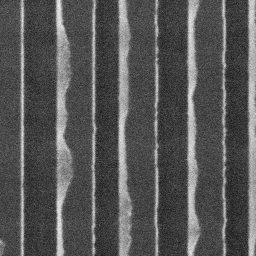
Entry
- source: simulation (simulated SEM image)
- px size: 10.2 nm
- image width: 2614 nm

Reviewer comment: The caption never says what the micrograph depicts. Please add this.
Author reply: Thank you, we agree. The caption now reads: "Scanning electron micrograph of lines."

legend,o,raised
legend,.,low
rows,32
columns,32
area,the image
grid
ooo....ooooo...ooooo....oooo...o
ooo....ooooo...ooooo....oooo...o
ooo....ooooo...ooooo....oooo...o
ooo....ooooo...ooooo....oooo...o
ooo.....oooo...ooooo....oooo....
ooo.....oooo...ooooo....oooo....
ooo.....oooo...ooooo....oooo....
ooo.....oooo...ooooo....oooo....
ooo.....oooo...ooooo....oooo....
ooo.....oooo...ooooo....oooo....
ooo.....oooo...ooooo....oooo...o
ooo.....oooo...ooooo....oooo...o
ooo.....oooo...ooooo....oooo...o
ooo.....oooo...ooooo....oooo...o
ooo.....oooo...ooooo....oooo....
ooo.....oooo...ooooo....oooo...o
ooo....ooooo...ooooo....oooo...o
ooo....ooooo...ooooo....oooo...o
ooo.....oooo...ooooo....oooo....
ooo.....oooo...ooooo....oooo....
ooo.....oooo...ooooo....oooo....
ooo.....oooo...ooooo....oooo....
ooo.....oooo...ooooo....oooo....
ooo.....oooo...ooooo....oooo....
ooo....ooooo...ooooo....oooo....
ooo....ooooo....oooo....oooo....
ooo....ooooo....oooo....oooo....
ooo....ooooo....oooo....oooo....
ooo....ooooo....oooo....oooo....
ooo....ooooo....oooo....oooo...o
ooo....ooooo...ooooo....oooo...o
ooo....ooooo...ooooo....oooo...o